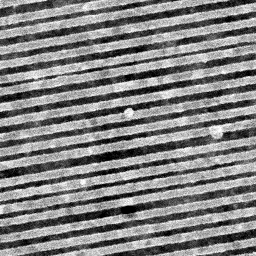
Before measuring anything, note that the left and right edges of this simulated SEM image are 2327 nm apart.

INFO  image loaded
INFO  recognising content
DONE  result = parallel lines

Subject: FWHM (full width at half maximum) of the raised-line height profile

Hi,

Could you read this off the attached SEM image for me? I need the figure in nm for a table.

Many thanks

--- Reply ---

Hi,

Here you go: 66.1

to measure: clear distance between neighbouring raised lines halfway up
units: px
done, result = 7.27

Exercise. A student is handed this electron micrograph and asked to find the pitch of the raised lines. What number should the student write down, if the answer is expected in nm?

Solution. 131